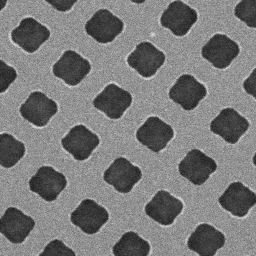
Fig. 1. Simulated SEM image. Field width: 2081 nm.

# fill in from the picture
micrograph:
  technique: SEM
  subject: a regular array of holes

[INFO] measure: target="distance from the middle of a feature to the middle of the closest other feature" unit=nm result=427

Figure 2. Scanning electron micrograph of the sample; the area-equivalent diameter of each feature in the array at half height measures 288 nanometres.